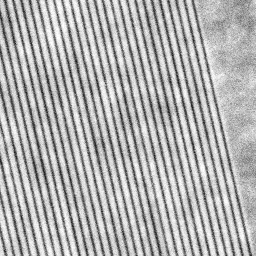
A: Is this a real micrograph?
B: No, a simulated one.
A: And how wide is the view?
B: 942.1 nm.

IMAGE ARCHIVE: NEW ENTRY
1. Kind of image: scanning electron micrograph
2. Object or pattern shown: parallel lines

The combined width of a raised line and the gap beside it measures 29.2 nm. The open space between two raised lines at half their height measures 7.1 nm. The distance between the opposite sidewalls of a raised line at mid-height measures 20.6 nm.